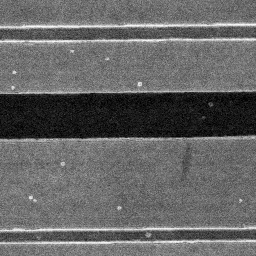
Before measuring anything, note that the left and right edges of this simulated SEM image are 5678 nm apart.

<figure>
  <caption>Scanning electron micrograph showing lines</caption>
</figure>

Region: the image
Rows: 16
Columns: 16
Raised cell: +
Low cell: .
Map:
++++++++++++++++
++++++++++++++++
++++++++++++++++
++++++++++++++++
++++++++++++++++
++++++++++++++++
................
................
................
++++++++++++++++
++++++++++++++++
++++++++++++++++
++++++++++++++++
++++++++++++++++
++++++++++++++++
++++++++++++++++